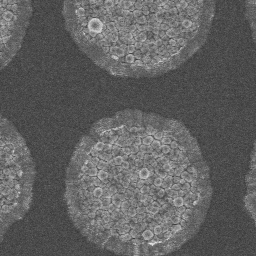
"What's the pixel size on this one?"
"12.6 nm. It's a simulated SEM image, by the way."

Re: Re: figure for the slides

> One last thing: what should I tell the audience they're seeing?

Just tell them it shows raised bodies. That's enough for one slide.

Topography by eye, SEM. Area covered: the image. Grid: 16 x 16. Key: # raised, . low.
#...#########...
#....########...
#....#######....
......#####.....
................
................
................
.......##.......
#.....#####.....
#....#######....
##...########...
##...########...
#....########...
#....#######....
......######....
........##......